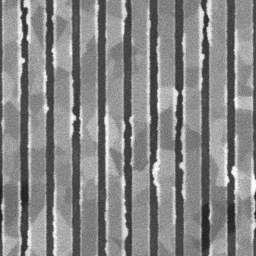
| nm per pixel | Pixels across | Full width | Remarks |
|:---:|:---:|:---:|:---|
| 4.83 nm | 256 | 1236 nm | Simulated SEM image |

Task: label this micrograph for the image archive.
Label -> parallel lines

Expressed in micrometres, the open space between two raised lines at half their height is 0.041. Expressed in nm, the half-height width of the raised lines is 86.3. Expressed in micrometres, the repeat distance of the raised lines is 0.125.